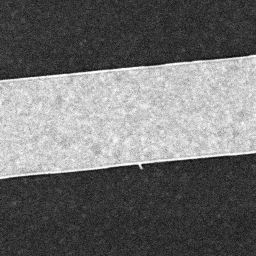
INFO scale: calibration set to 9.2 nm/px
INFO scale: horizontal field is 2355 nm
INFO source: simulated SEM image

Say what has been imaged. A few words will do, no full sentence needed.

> one or a few lines or trenches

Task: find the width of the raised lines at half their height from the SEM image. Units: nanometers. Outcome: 884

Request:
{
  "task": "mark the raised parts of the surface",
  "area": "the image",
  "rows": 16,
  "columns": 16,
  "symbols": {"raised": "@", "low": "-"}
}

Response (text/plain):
----------------
----------------
----------------
----------------
------@@@@@@@@@@
@@@@@@@@@@@@@@@@
@@@@@@@@@@@@@@@@
@@@@@@@@@@@@@@@@
@@@@@@@@@@@@@@@@
@@@@@@@@@@@@@@@@
@@@@@@----------
----------------
----------------
----------------
----------------
----------------